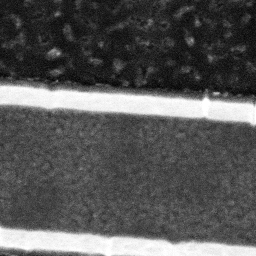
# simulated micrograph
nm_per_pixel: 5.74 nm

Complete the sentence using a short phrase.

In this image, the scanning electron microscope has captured one or a few lines or trenches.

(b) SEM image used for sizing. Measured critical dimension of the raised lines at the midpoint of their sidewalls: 834 nanometers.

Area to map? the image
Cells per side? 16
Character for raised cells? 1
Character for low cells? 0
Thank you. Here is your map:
0000000000000000
0000000000000000
0000000000000000
0000000000000000
0000000000000000
0000000000000000
1111111110000000
1111111111111111
1111111111111111
1111111111111111
1111111111111111
1111111111111111
1111111111111111
1111111111111111
1111111111111111
0000000011111111